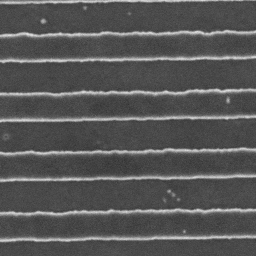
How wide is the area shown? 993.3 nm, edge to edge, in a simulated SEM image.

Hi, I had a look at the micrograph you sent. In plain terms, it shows lines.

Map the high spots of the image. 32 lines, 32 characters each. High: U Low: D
DDDDDDDDDDDDDDDDDDDDDDDDDDDDDDDD
DDDDDDDDDDDDDDDDDDDDDDDDDDDDDDDD
DDDDDDDDDDDDDDDDDDDDDDDDDDDDDDDD
DDDDDDDDDDDDDDDDDDDDDDDDDDDDDDDD
UUUUUUUUUUUUUUUUUUUUUUUUUUUUUUUU
UUUUUUUUUUUUUUUUUUUUUUUUUUUUUUUU
UUUUUUUUUUUUUUUUUUUUUUUUUUUUUUUU
UUUUUUUUUUUDDUDDDDDDDDDDDDDDDDDD
DDDDDDDDDDDDDDDDDDDDDDDDDDDDDDDD
DDDDDDDDDDDDDDDDDDDDDDDDDDDDDDDD
DDDDDDDDDDDDDDDDDDDDDDDDDDDDDDDD
DDDDDDDDDDUUDDUDUUDDUDDUUUUUUUUU
UUUUUUUUUUUUUUUUUUUUUUUUUUUUUUUU
UUUUUUUUUUUUUUUUUUUUUUUUUUUUUUUU
UUUUUUUUUUUUUUUUUUUUUUUUUUUUUUUU
DDDDDDDDDDDDDDDDDDDDDDDDDDDDDDDD
DDDDDDDDDDDDDDDDDDDDDDDDDDDDDDDD
DDDDDDDDDDDDDDDDDDDDDDDDDDDDDDDD
DDDDDDDDDDDDDDDDDDDDDDDDDDDDDDDD
UUUUUUUUUUUUUUUUUUUUUUUUUUUUUUUU
UUUUUUUUUUUUUUUUUUUUUUUUUUUUUUUU
UUUUUUUUUUUUUUUUUUUUUUUUUUUUUUUU
UDDDDDDDDDDDDDDDDDDDDDDDDDDDDDDD
DDDDDDDDDDDDDDDDDDDDDDDDDDDDDDDD
DDDDDDDDDDDDDDDDDDDDDDDDDDDDDDDD
DDDDDDDDDDDDDDDDDDDDDDDDDDDDDDDD
DDDDDDDDDUUUUUUUUUUUUUUUUUUUUUUU
UUUUUUUUUUUUUUUUUUUUUUUUUUUUUUUU
UUUUUUUUUUUUUUUUUUUUUUUUUUUUUUUU
UUUUUUUUUUUUUUUUUUUUUUUUUUUUUUUU
DDDDDDDDDDDDDDDDDDDDDDDDDDDDDDDD
DDDDDDDDDDDDDDDDDDDDDDDDDDDDDDDD